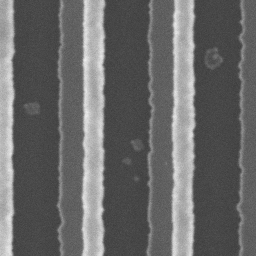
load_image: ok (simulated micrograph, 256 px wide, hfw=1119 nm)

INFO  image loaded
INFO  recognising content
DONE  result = lines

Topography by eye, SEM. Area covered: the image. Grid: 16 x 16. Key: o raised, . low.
o...ooo..ooo...o
o...oo...ooo...o
o...ooo..ooo...o
o...ooo..ooo...o
o...oo...ooo...o
o...oo...ooo...o
o...ooo..ooo...o
o...oo...ooo...o
o...oo...ooo...o
o...oo...ooo...o
o...oo...ooo...o
o...oo...ooo...o
o...oo...ooo...o
o...oo...ooo...o
o...oo...ooo...o
o...oo...ooo...o